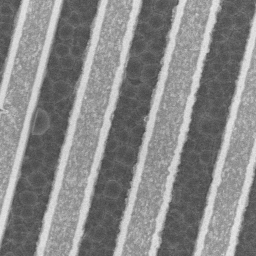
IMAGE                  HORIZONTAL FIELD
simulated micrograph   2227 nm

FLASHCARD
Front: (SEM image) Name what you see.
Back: one or a few lines or trenches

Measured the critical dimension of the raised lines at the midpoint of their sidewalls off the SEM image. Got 32.8 px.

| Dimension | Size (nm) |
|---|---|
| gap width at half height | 376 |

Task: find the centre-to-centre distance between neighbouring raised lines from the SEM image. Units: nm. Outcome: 662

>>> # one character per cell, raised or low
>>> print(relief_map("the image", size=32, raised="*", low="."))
...****......****......****.....
...****......****.....*****.....
...****.....*****.....****......
..*****.....****......****......
..****......****......****......
..****......****.....*****.....*
..****.....*****.....****......*
.****......****......****......*
.****......****......****......*
.****......****.....*****.....**
.****.....*****.....****......**
****......****......****......**
****......****......****......**
****......****.....*****.....***
****.....****......****......***
***......****......****......***
***......****......****......***
***......****.....*****.....****
***.....*****.....****......****
**......****......****......****
**......****......****.....****.
**......****.....*****.....****.
**.....****......****......****.
*......****......****......****.
*......****......****......***..
*......****.....*****.....****..
*.....*****.....****......****..
......****......****......****..
......****......****......****..
.....*****.....****......****...
.....*****.....****......****...
.....****......****......****...